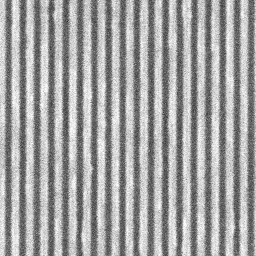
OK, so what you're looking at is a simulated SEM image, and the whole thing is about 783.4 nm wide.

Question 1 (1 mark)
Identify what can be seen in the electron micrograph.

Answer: parallel lines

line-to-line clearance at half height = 24.1 nanometers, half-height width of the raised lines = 21.4 nanometers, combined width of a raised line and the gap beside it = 43.7 nanometers